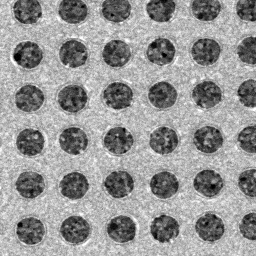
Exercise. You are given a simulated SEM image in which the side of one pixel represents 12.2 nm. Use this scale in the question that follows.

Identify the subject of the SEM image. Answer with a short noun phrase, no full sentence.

a regular array of raised bodies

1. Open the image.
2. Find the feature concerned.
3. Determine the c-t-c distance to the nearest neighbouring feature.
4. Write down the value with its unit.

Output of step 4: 526 nm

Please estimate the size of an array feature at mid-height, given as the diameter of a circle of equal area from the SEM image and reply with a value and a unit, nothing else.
363 nanometres